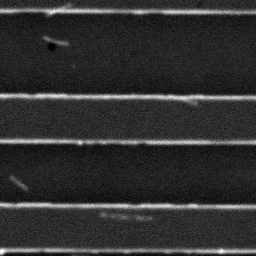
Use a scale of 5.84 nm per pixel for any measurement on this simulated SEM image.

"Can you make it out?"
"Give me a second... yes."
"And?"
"lines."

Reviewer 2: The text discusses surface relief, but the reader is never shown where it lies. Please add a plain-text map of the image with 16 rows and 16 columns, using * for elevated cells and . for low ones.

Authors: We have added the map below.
****************
................
................
................
................
................
****************
****************
****************
................
................
................
................
****************
****************
****************